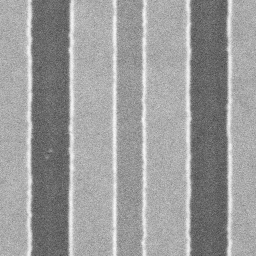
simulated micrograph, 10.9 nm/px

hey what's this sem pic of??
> lines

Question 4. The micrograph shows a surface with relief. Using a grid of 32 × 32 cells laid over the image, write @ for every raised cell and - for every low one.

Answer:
@@@@-----@@@@@@@@@@@@@@@-----@@@
@@@@-----@@@@@@@@@@@@@@@-----@@@
@@@@-----@@@@@@@@@@@@@@@-----@@@
@@@@-----@@@@@@@@@@@@@@@-----@@@
@@@@-----@@@@@@@@@@@@@@@-----@@@
@@@@-----@@@@@@@@@@@@@@@-----@@@
@@@@-----@@@@@@@@@@@@@@@-----@@@
@@@@-----@@@@@@@@@@@@@@@-----@@@
@@@@-----@@@@@@@@@@@@@@@-----@@@
@@@@-----@@@@@@@@@@@@@@@-----@@@
@@@@-----@@@@@@@@@@@@@@@-----@@@
@@@@-----@@@@@@@@@@@@@@@-----@@@
@@@@-----@@@@@@@@@@@@@@@-----@@@
@@@@-----@@@@@@@@@@@@@@@-----@@@
@@@@-----@@@@@@@@@@@@@@@-----@@@
@@@@-----@@@@@@@@@@@@@@@-----@@@
@@@@-----@@@@@@@@@@@@@@@----@@@@
@@@@-----@@@@@@@@@@@@@@@-----@@@
@@@@-----@@@@@@@@@@@@@@@-----@@@
@@@@-----@@@@@@@@@@@@@@@-----@@@
@@@@-----@@@@@@@@@@@@@@@-----@@@
@@@@-----@@@@@@@@@@@@@@@-----@@@
@@@@-----@@@@@@@@@@@@@@@-----@@@
@@@@-----@@@@@@@@@@@@@@@-----@@@
@@@@-----@@@@@@@@@@@@@@@-----@@@
@@@@-----@@@@@@@@@@@@@@@-----@@@
@@@@-----@@@@@@@@@@@@@@@-----@@@
@@@@-----@@@@@@@@@@@@@@@-----@@@
@@@@-----@@@@@@@@@@@@@@@-----@@@
@@@@-----@@@@@@@@@@@@@@@-----@@@
@@@@-----@@@@@@@@@@@@@@@-----@@@
@@@@-----@@@@@@@@@@@@@@@-----@@@